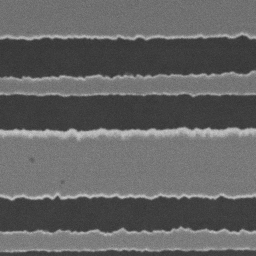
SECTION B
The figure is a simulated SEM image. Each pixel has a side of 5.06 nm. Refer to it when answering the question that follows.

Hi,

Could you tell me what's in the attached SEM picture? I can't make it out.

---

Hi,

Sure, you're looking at lines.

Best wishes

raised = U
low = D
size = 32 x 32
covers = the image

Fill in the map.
UUUUUUUUUUUUUUUUUUUUUUUUUUUUUUUU
UUUUUUUUUUUUUUUUUUUUUUUUUUUUUUUU
UUUUUUUUUUUUUUUUUUUUUUUUUUUUUUUU
UUUUUUUUUUUUUUUUUUUUUUUUUUUUUUUU
UUUUUUUUUUUUUUUUUUUUUUUUUUUUUUDU
DDDDDDDDDDDDDDDDDDDDDDDDDDDDDDDD
DDDDDDDDDDDDDDDDDDDDDDDDDDDDDDDD
DDDDDDDDDDDDDDDDDDDDDDDDDDDDDDDD
DDDDDDDDDDDDDDDDDDDDDDDDDDDDDDDD
DDDDDDDDDDDUUDDDDUDUUUUUUUUUUUUU
UUUUUUUUUUUUUUUUUUUUUUUUUUUUUUUU
UUUUUUUUUUUUUUUUUUUUUUUUUUUUUUUU
DDDDDDDDDDDDDDDDDDDDDDDDDDDDDDDD
DDDDDDDDDDDDDDDDDDDDDDDDDDDDDDDD
DDDDDDDDDDDDDDDDDDDDDDDDDDDDDDDD
DDDDDDDDDDDDDDDDDDDDDDDDDDDDDDDD
UUUUUUUDUUDUUUUUUUUUUUUUUUUUUUUU
UUUUUUUUUUUUUUUUUUUUUUUUUUUUUUUU
UUUUUUUUUUUUUUUUUUUUUUUUUUUUUUUU
UUUUUUUUUUUUUUUUUUUUUUUUUUUUUUUU
UUUUUUUUUUUUUUUUUUUUUUUUUUUUUUUU
UUUUUUUUUUUUUUUUUUUUUUUUUUUUUUUU
UUUUUUUUUUUUUUUUUUUUUUUUUUUUUUUU
UUUUUUUUUUUUUUUUUUUUUUUUUUUUUUUU
UUUUUUUUUUUUUUUUUUUUUUUUUUUUUUUU
DDDDDDDDDDDDDDDDDDDDDDDDDDDDDDDD
DDDDDDDDDDDDDDDDDDDDDDDDDDDDDDDD
DDDDDDDDDDDDDDDDDDDDDDDDDDDDDDDD
DDDDDDDDDDDDDDDDDDDDDDDDDDDDDDDD
UUUUUUUUUUUUUUUUUUUUUUUUUUUUUUUU
UUUUUUUUUUUUUUUUUUUUUUUUUUUUUUUU
DDDDDDDDDDDDDDDDDDDDDDDDDDDDDDDD